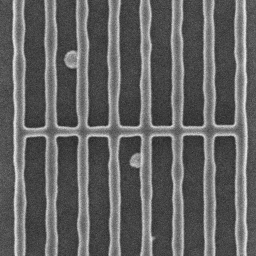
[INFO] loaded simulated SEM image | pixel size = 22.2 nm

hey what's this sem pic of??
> groups of lines, slits or small figures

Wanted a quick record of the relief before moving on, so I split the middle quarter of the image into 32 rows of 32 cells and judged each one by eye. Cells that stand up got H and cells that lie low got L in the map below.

LLLHHHLLLLLHHHLLLLLLHLLLLLLHHHLL
LLLHHHLLLLLHHHLLLLLLHLLLLLLHHHLL
LLLHHHLLLLLHHHLLLLLLHLLLLLLHHHLL
LLLHHHLLLLLHHHLLLLLHHLLLLLLHHHLL
LLLHHHLLLLLHHHLLLLLHHHLLLLLHHHLL
LLLHHHLLLLLHHHLLLLLHHHLLLLLHHHLL
LLLHHHLLLLLHHHLLLLLHHHLLLLLHHHLL
LLLHHHLLLLLHHHLLLLLHHHLLLLLHHHLL
LLLHHHLLLLLHHHLLLLLLHHLLLLLHHHLL
LLLHHHLLLLLHHLLLLLLLHHLLLLLHHHLL
LLLHHHLLLLLHHLLLLLLLHHLLLLLHHHLL
LLLHHHLLLLLLHLLLLLLHHHLLLLLHHHLL
LLLHHHLLLLLHHHLLLLLHHHLLLLLHHHLL
LLLLHHLLLLLHHHLLLLLHHHLLLLLHHHLL
LLLLHHLLLLLHHHLLLLLHHHLLLLLHHLLL
LLLHHHLLLLLHHHLLLLLHHHLLLLLHHHLL
HHHHHHHHHHHHHHHHHHHHHHHHHHHHHHHH
HHHHHHHHHHHHHHHHHHHHHHHHHHHHHHHH
LLLLHHLLLLLHHHLLLLLHHHLLLLLHHHLL
LLLLHHLLLLLHHHLLLLLLHHLLLLLHHHLL
LLLLHHLLLLLHHHLLLLLHHHLLLLLHHHLL
LLLLHHLLLLLLHHLLLLLHHHLLLLLHHHLL
LLLLHHLLLLLLHLLLLLLHHHLLLLLHHLLL
LLLLHHLLLLLLHLLLLLLHHHLLLLLLHLLL
LLLLHHLLLLLHHHLLLLHHHHLLLLLHHHLL
LLLLHHLLLLLHHHLLLLLHHHLLLLLHHHLL
LLLLHHLLLLLHHHLLLLLHHHLLLLLHHHLL
LLLLHHLLLLLHHHLLLLLHHHLLLLLHHHLL
LLLLHHLLLLLHHHLLLLLHHHLLLLLHHHLL
LLLLHHLLLLLHHHLLLLLHHHLLLLLHHHLL
LLLLHHLLLLLHHHLLLLLHHHLLLLLLHLLL
LLLLHHLLLLLLHHLLLLLHHHLLLLLLHLLL